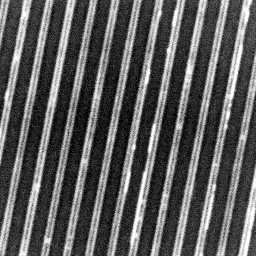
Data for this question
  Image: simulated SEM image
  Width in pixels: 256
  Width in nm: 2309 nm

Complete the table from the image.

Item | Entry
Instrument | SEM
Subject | parallel lines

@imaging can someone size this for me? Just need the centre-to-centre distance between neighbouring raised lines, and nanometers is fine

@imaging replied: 194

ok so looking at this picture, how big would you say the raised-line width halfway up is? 0.0432 microns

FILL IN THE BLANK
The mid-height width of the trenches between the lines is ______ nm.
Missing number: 147